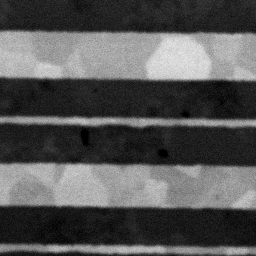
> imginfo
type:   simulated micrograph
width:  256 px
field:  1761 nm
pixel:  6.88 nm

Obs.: lines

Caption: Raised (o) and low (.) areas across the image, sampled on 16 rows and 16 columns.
................
................
oooooooooooooooo
oooooooooooooooo
oooooooooooooooo
................
................
................
................
................
oooooooooooooooo
oooooooooooooooo
oooooooooooooooo
................
................
................